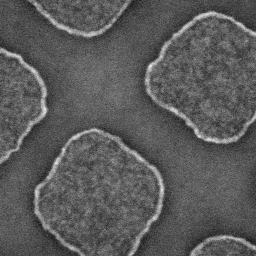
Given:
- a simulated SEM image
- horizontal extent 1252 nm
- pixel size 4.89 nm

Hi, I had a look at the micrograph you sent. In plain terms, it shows raised bodies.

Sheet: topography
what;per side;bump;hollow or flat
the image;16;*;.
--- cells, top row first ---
..******........
...****.....***.
...........*****
*.........******
**.......*******
***......*******
***.......******
**..........****
**...**......**.
*...****........
...*******......
...*******......
..********......
..********......
...******.......
....****....****